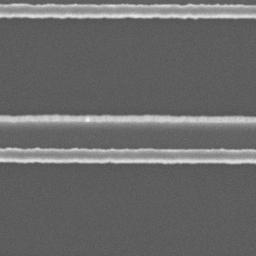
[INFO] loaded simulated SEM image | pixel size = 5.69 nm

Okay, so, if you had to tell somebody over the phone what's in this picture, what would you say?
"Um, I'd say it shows lines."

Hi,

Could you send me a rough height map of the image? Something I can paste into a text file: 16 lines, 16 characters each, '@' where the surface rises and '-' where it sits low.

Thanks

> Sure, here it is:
@@@@@@@@@@@@@@@@
----------------
----------------
----------------
----------------
----------------
----------------
-@-@@@@---------
@@@@@@@@@@@@@@@@
@@@@@@@@@@@@@@@@
----------------
----------------
----------------
----------------
----------------
----------------